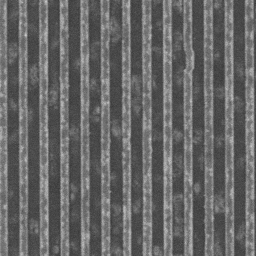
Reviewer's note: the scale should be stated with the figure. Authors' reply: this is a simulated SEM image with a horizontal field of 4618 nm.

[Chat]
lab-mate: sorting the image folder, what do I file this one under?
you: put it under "parallel lines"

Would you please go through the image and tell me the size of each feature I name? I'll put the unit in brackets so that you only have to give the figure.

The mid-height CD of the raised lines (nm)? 122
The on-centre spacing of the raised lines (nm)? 371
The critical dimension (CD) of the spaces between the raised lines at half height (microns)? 0.243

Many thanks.